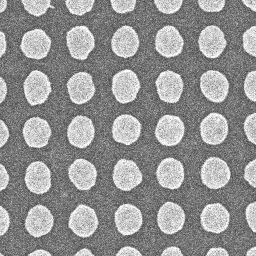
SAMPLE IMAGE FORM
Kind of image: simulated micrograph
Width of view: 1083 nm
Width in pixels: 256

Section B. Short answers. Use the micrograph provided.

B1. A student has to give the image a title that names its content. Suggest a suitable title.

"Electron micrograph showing a regular array of raised bodies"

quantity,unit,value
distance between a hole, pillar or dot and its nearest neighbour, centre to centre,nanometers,184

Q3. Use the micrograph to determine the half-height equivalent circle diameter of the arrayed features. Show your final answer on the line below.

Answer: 28.9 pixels